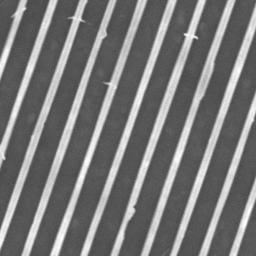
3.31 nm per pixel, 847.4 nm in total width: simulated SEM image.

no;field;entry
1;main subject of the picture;parallel lines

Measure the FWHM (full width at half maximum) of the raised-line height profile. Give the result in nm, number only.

22.7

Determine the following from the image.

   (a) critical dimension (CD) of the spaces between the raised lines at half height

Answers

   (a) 70.9 nanometers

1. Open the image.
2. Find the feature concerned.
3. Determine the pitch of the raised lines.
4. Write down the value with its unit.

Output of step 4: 28.1 px